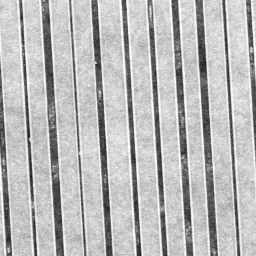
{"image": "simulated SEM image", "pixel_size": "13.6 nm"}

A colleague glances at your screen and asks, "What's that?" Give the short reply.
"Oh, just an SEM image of parallel lines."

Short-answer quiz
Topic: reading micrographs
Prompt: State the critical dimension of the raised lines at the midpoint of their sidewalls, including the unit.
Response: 248 nm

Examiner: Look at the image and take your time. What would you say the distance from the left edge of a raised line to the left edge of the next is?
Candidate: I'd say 345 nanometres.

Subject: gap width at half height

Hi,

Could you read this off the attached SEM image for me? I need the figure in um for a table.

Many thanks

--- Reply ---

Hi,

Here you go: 0.0917